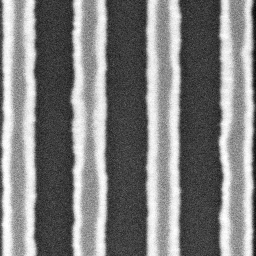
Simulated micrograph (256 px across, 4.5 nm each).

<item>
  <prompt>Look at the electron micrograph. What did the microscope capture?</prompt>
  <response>lines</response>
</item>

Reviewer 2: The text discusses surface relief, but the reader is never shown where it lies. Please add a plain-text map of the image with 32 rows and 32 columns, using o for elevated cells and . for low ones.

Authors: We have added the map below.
.ooo.....oooo......ooo......ooo.
.ooo.....oooo......ooo......ooo.
.ooo.....oooo......ooo......ooo.
.ooo.....oooo.....oooo......ooo.
.ooo.....oooo......ooo......ooo.
.ooo.....oooo......ooo......ooo.
.ooo.....oooo......ooo......ooo.
.ooo.....oooo......ooo......ooo.
.ooo.....oooo......ooo......ooo.
.ooo.....oooo......ooo......ooo.
.ooo.....oooo......ooo......ooo.
.ooo.....oooo......ooo......oooo
.ooo.....oooo......ooo......oooo
.ooo.....oooo......ooo......oooo
.ooo.....oooo......ooo......oooo
.ooo.....oooo......ooo......ooo.
.ooo.....oooo......ooo......oooo
oooo.....oooo......ooo......ooo.
oooo.....oooo......ooo......ooo.
oooo.....oooo......ooo......ooo.
oooo.....oooo......ooo......ooo.
oooo.....oooo......ooo......ooo.
.ooo.....oooo......ooo......oooo
.ooo.....oooo......ooo......oooo
.ooo.....oooo......ooo......ooo.
.ooo.....oooo......ooo......ooo.
.ooo.....oooo......ooo......ooo.
.ooo.....oooo......ooo......ooo.
.ooo.....oooo......ooo......oooo
.ooo.....oooo......ooo......ooo.
.ooo.....oooo......ooo......ooo.
.ooo.....oooo......ooo......ooo.